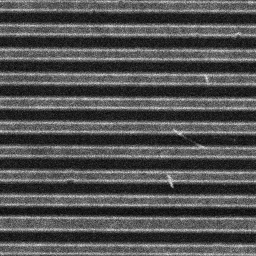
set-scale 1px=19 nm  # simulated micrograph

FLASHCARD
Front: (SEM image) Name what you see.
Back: parallel lines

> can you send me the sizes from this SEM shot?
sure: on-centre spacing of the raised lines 461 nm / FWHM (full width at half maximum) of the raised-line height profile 12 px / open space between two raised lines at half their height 247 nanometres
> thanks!